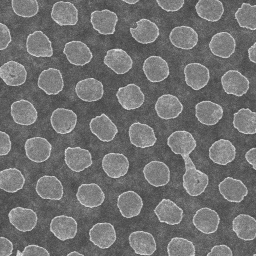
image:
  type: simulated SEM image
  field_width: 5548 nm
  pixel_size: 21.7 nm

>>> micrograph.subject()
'a regular array of raised bodies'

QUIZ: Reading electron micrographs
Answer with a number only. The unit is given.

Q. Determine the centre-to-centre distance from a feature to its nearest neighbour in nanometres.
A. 843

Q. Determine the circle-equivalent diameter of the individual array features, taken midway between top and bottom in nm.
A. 548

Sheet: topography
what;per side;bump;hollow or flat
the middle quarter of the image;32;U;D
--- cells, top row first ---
DDDDDDDDDDDUUUUUUDDDUUUUUUDDDDDU
DDDDDDDDDDDDUUUUDDDDUUUUUUDDDDUU
DDDDDDDDDDDDDDDDDDDDUUUUUUDDDDUU
DDDDDDDDDDDDDDDDDDDDDUUUUDDDDDUU
DDDDUUUUUDDDDDDDDDDDDDDDDDDDDDDU
DDDUUUUUUUDDDDDDUUDDDDDDDDDDDDDU
DDDUUUUUUUDDDDUUUUUDDDDDDDDDDDDD
DDDUUUUUUUDDDUUUUUUUDDDDDDDDDDDD
DDDDUUUUUDDDDDUUUUUUDDDDUUUUDDDD
DDDDDDDDDDDDDDUUUUUUDDDUUUUUUDDD
DDDDDDDDDDDDDDDUUUUDDDDUUUUUUDDD
UDDDDDDDDDDDDDDDDDDDDDDUUUUUUDDD
UUUDDDDDDDDDDDDDDDDDDDDDUUUUUDDD
UUUDDDDDUUUDDDDDDDDDDDDDDUUDDDDD
UUUDDDDUUUUUDDDDDDDDDDDDDDDDDDDD
UDUDDDDUUUUUUDDDDUUUUDDDDDDDDDDD
DUDDDDDUUUUUUDDDUUUUUUDDDDDDDDDD
DDDDDDDDUUUUUDDDUUUUUUUDDDDUUUUU
DDDDDDDDDUUUDDDDDUUUUUUDDDUUUUUU
DDDDDDDDDDDDDDDDDUUUUUUDDDUUUUUU
DDDDDDDDDDDDDDDDDDUUUUDDDDUUUUUU
DUUUUUDDDDDDDDDDDDDDDDDDDDDUUUUU
UUUUUUUDDDDUUUDDDDDDDDDDDDDDDUUD
UUUUUUUDDDUUUUUUDDDDDDDDDDDDDDUD
UUUUUUUDDDUUUUUUDDDDDDUUDDDDDDDU
DUUUUUDDDDUUUUUUDDDDUUUUUUDDDDUU
DDUUUDDDDDUUUUUUDDDDUUUUUUDDDDDU
DDDDDDDDDDDUUUUDDDDDUUUUUUDDDDUU
DDDDDDDDDDDDDDDDDDDDUUUUUUDDDDUU
DDDDDDDDDDDDDDDDDDDDDUUUUUDDDDUU
DDDDUUUUDDDDDDDDDDDDDDDUDDDDDDUU
DDDDUUUUUDDDDDDDDDDDDDDDDDDDDDDU